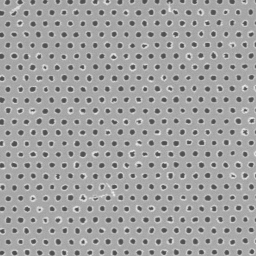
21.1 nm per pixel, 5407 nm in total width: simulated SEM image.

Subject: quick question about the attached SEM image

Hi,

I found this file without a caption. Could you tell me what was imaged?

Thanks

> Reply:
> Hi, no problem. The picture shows a regular array of holes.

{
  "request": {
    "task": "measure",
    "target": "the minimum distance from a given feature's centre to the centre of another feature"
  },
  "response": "254 nanometers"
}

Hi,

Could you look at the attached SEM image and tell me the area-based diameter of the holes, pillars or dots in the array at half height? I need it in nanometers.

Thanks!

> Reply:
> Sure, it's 104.